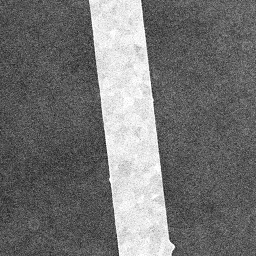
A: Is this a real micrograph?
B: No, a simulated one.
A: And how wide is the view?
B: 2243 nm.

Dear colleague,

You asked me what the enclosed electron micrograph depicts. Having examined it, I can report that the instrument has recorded one or a few lines or trenches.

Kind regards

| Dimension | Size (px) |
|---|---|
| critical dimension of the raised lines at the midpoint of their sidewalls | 51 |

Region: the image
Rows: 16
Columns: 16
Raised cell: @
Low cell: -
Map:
------@@@-------
------@@@-------
------@@@-------
------@@@-------
------@@@-------
------@@@-------
------@@@@------
------@@@@------
-------@@@------
-------@@@------
-------@@@------
-------@@@------
-------@@@------
-------@@@------
-------@@@@-----
-------@@@@-----